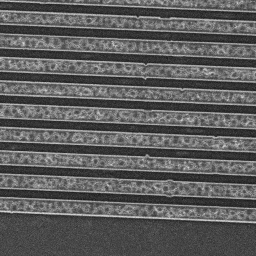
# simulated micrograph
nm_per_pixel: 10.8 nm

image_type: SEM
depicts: parallel lines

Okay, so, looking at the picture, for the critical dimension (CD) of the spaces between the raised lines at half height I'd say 100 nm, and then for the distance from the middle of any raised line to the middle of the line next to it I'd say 253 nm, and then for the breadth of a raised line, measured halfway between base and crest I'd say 13.9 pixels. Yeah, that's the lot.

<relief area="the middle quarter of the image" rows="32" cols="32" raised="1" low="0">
11111111111111111111111111111110
11111111111111111111111111111111
00111111111111111111111111111111
00000000000000000000100000000011
00000000000000000000000000000000
11111111111100000000000000000000
11111111111111111111111111111111
11111111111111111111111111111111
00000001111111111111111111111111
00000000000000000000000000000011
00000000000000000000000000000000
11111111111111111100000000000000
11111111111111111111111111111111
11111111111111111111111111111111
00000000000011111111111111111111
00000000000000000000000000000000
00000000000000000000000000000000
11111111111111111000000000000000
11111111111111111111111111111111
11111111111111111111111111111111
00000000000000000111111111111111
00000000000000000000000000000000
00000000000000000000000000000000
11111111111111111111110000000000
11111111111111111111111111111111
11111111111111111111111111111111
00000000000000000000001111111111
00000000000000000000000000000000
11110000000000000000000000000000
11111111111111111111111111110000
11111111111111111111111111111111
11111111111111111111111111111111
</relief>